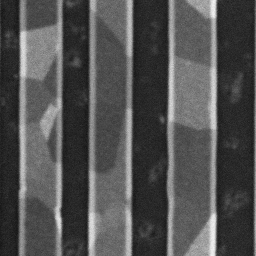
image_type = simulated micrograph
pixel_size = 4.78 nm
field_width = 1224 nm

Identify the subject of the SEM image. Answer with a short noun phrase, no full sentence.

one or a few lines or trenches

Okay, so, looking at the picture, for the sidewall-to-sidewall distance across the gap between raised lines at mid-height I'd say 173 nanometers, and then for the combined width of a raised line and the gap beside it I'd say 361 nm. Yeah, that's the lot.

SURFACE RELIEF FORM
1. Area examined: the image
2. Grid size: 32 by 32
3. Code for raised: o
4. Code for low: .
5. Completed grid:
...oooo.....oooo.....oooooo.....
...oooo.....oooo.....oooooo.....
...oooo.....oooo.....oooooo.....
...oooo.....oooo.....oooooo.....
...ooooo....oooo.....oooooo.....
...ooooo....oooo.....oooooo.....
...ooooo....oooo.....oooooo.....
...ooooo....oooo.....oooooo.....
...oooo.....oooo.....oooooo.....
...oooo.....oooo.....oooooo.....
...oooo.....oooo.....oooooo.....
...oooo.....oooo.....oooooo.....
...oooo.....oooo.....oooooo.....
...oooo.....oooo.....oooooo.....
...oooo.....oooo.....oooooo.....
...oooo.....oooo.....oooooo.....
...oooo.....oooo.....oooooo.....
...oooo.....oooo.....oooooo.....
...oooo.....oooo.....oooooo.....
...oooo....ooooo.....oooooo.....
...oooo....ooooo.....oooooo.....
...oooo....ooooo.....oooooo.....
...oooo....ooooo.....oooooo.....
...oooo....ooooo.....oooooo.....
...oooo....ooooo.....oooooo.....
...oooo....ooooo.....oooooo.....
...oooo....ooooo.....oooooo.....
...oooo....ooooo.....oooooo.....
...oooo....ooooo.....oooooo.....
...oooo....ooooo.....oooooo.....
...oooo....ooooo.....oooooo.....
...oooo....ooooo.....oooooo.....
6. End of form